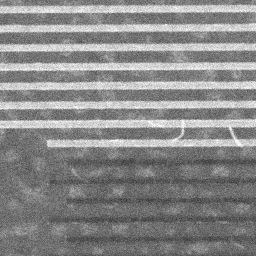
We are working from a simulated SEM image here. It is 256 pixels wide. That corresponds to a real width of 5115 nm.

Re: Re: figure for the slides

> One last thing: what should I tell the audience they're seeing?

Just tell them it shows parallel lines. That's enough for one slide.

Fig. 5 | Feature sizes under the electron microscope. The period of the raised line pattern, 19.2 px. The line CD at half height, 0.12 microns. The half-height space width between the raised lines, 262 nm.